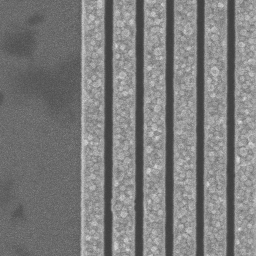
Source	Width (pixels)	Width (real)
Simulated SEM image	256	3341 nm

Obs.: parallel lines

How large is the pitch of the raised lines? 399 nanometers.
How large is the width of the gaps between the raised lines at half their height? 101 nanometers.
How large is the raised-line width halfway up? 0.292 um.